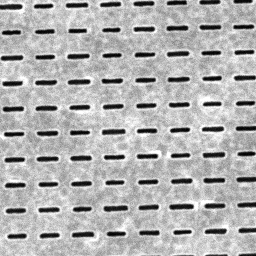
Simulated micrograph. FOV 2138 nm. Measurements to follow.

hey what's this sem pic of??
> a regular array of holes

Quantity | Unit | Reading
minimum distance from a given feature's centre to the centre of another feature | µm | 0.212